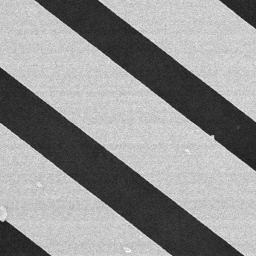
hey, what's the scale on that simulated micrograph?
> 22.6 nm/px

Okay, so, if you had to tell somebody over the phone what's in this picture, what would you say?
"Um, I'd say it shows lines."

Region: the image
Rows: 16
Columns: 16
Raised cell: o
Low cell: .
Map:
ooo....ooooooo..
oooo....oooooooo
ooooo....ooooooo
ooooooo....ooooo
oooooooo....oooo
..ooooooo....ooo
...oooooooo....o
....oooooooo....
o.....ooooooo...
oo.....ooooooo..
oooo....oooooooo
ooooo....ooooooo
oooooo.....ooooo
oooooooo....oooo
.oooooooo....ooo
...ooooooo.....o